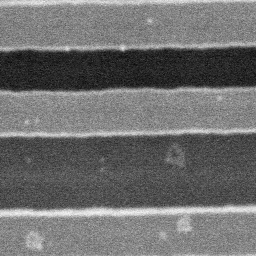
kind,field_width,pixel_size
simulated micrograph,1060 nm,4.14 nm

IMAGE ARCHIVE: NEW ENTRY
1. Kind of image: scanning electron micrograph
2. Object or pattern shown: lines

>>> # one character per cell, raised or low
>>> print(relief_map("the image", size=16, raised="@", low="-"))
@@@@@@@@@@@@@@@@
@@@@@@@@@@@@@@@@
@@@@@@@@@@@@@@@@
----------------
----------------
----------------
@@@@@@@@@@@@@@@@
@@@@@@@@@@@@@@@@
----------------
----------------
----------------
----------------
----------------
@@@@@@@@@@@@@@@@
@@@@@@@@@@@@@@@@
@@@@@@@@@@@@@@@@